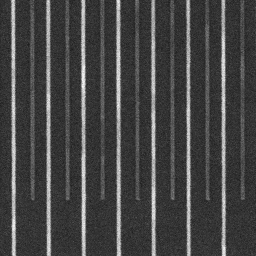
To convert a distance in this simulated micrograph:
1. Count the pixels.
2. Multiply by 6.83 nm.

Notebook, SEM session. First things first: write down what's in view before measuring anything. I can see parallel lines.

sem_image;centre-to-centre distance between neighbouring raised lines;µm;0.12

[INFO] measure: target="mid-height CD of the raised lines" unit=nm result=17.1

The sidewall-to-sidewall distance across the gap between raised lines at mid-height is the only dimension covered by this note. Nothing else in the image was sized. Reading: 109 nm